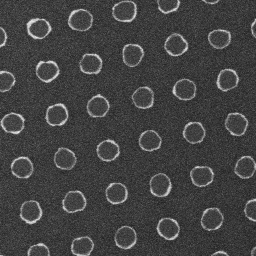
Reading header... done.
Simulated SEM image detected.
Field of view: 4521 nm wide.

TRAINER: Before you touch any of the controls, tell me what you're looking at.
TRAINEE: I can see a regular array of raised bodies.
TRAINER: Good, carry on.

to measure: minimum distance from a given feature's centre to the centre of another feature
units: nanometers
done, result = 757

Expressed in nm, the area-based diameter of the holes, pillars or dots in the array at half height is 381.